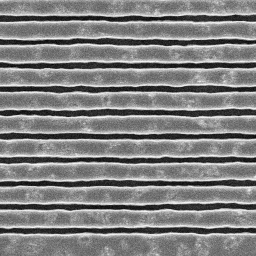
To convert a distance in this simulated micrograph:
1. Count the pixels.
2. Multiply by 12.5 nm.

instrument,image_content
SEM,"parallel lines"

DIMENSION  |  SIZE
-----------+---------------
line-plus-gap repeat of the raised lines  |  0.295 microns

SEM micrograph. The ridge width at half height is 17.4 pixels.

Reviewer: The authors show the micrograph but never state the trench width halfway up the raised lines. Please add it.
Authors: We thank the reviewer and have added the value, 80 nanometers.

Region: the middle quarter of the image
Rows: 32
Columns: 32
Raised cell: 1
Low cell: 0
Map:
00000000000000000000000000000000
11111101111111111111111111111111
11111111111111111111111111111111
11111111111111111111111111111111
11111111111111111111111111111111
00000000000000000000000000000000
00000000000000000000000000000000
11111100011111111111111111111111
11111111111111111111111111111111
11111111111111111111111111111111
11111111111111111111111111111111
00000000000000000000000000000000
00000000000000000000000000000000
10011101111111111111111111111111
11111111111111111111111111111111
11111111111111111111111111111111
11111111111111111111111111111111
00000000000000000000000000000000
00000000000000000000000000000000
11111111111111111111111111111111
11111111111111111111111111111111
11111111111111111111111111111111
11111111111111111111111111111111
00000000000000000000000000000000
00000000000000000000000000000000
11111111111111111111111111111111
11111111111111111111111111111111
11111111111111111111111111111111
11111111111111111111111111111111
00000000000000000000000000000000
00000000000000000000000000000000
11111111111111111111111111111111